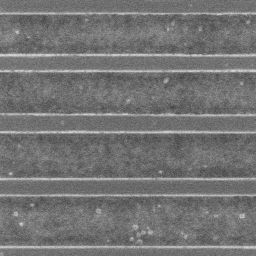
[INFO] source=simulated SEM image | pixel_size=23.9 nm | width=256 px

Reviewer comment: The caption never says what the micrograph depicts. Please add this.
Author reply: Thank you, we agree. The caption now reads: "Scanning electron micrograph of lines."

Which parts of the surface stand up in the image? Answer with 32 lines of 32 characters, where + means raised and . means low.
++++++++++++++++++++++++++++++++
++++++++++++++++++++++++++++++++
................................
................................
................................
................................
................................
++++++++++++++++++++++++++++++++
++++++++++++++++++++++++++++++++
................................
................................
................................
................................
................................
++++++++++++++++++++++++++++++++
++++++++++++++++++++++++++++++++
++++++++++++++++++++++++++++++++
................................
................................
................................
................................
................................
++++++++++++++++++++++++++++++++
++++++++++++++++++++++++++++++++
................................
................................
................................
................................
................................
................................
................................
++++++++++++++++++++++++++++++++